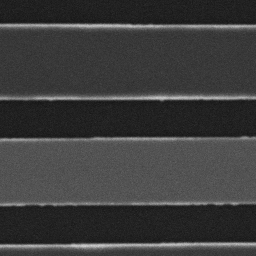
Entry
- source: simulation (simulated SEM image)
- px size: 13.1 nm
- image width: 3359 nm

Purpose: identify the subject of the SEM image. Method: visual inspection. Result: lines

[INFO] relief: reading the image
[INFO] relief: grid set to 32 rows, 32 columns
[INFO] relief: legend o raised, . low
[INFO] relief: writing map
................................
................................
................................
oooooooooooooooooooooooooooooooo
oooooooooooooooooooooooooooooooo
oooooooooooooooooooooooooooooooo
oooooooooooooooooooooooooooooooo
oooooooooooooooooooooooooooooooo
oooooooooooooooooooooooooooooooo
oooooooooooooooooooooooooooooooo
oooooooooooooooooooooooooooooooo
oooooooooooooooooooooooooooooooo
................................
................................
................................
................................
................................
oooooooooooooooooooooooooooooooo
oooooooooooooooooooooooooooooooo
oooooooooooooooooooooooooooooooo
oooooooooooooooooooooooooooooooo
oooooooooooooooooooooooooooooooo
oooooooooooooooooooooooooooooooo
oooooooooooooooooooooooooooooooo
oooooooooooooooooooooooooooooooo
oooooooooooooooooooooooooooo.o..
................................
................................
................................
................................
.....................ooooooooooo
oooooooooooooooooooooooooooooooo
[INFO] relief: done